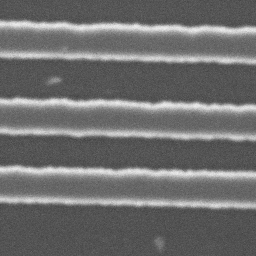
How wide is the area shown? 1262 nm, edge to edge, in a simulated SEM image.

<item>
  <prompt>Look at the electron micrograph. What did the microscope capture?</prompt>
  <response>lines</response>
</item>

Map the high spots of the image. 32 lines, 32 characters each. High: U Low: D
DDDDDDDDDDDDDDDDDDDDDDDDDDDDDDDD
DDDDDDDDDDDDDDDDDDDDDDDDDDDDDDDD
DDDDDDDDDDDDDDDDDDDDDDDDDDDDDDDD
UUUUUUUUUUUUUUUUUUUUUUUDDUUDDDDD
UUUUUUUUUUUUUUUUUUUUUUUUUUUUUUUU
UUUUUUUUUUUUUUUUUUUUUUUUUUUUUUUU
UUUUUUUUUUUUUUUUUUUUUUUUUUUUUUUU
DDDDDDDDDDDDDDDDDUUUUUUUUUUUUUUU
DDDDDDDDDDDDDDDDDDDDDDDDDDDDDDDD
DDDDDDDDDDDDDDDDDDDDDDDDDDDDDDDD
DDDDDDDDDDDDDDDDDDDDDDDDDDDDDDDD
DDDDDDDDDDDDDDDDDDDDDDDDDDDDDDDD
DUUDDDUDDDDDDDDDDDDDDDDDDDDDDDDD
UUUUUUUUUUUUUUUUUUUUUUUUUUUUUUUU
UUUUUUUUUUUUUUUUUUUUUUUUUUUUUUUU
UUUUUUUUUUUUUUUUUUUUUUUUUUUUUUUU
UUUUUUUUUUUUUUUUUUUUUUUUUUUUUUUU
DDDDDDDDDDDDDDDDDDDDDDDDDDDDDDDD
DDDDDDDDDDDDDDDDDDDDDDDDDDDDDDDD
DDDDDDDDDDDDDDDDDDDDDDDDDDDDDDDD
DDDDDDDDDDDDDDDDDDDDDDDDDDDDDDDD
UUUUUUUUUUUUUUUUUUUDUUDDDDDDDDDD
UUUUUUUUUUUUUUUUUUUUUUUUUUUUUUUU
UUUUUUUUUUUUUUUUUUUUUUUUUUUUUUUU
UUUUUUUUUUUUUUUUUUUUUUUUUUUUUUUU
DDDDDDDDDDDDDDDDDUUUUUUUUUUUUUUU
DDDDDDDDDDDDDDDDDDDDDDDDDDDDDDDD
DDDDDDDDDDDDDDDDDDDDDDDDDDDDDDDD
DDDDDDDDDDDDDDDDDDDDDDDDDDDDDDDD
DDDDDDDDDDDDDDDDDDDDDDDDDDDDDDDD
DDDDDDDDDDDDDDDDDDDDDDDDDDDDDDDD
DDDDDDDDDDDDDDDDDDDDDDDDDDDDDDDD